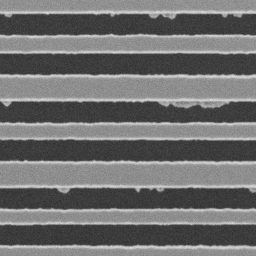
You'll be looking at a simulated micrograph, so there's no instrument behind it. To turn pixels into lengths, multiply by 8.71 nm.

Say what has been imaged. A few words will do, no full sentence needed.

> lines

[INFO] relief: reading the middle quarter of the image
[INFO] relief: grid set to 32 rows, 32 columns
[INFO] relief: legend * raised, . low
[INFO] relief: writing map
................................
................................
................................
********************************
********************************
********************************
********************************
********************************
********************************
................................
................................
................................
................................
................................
................................
********************************
********************************
********************************
********************************
................................
................................
................................
................................
................................
.**.******.*********.**..**.*.**
********************************
********************************
********************************
********************************
********************************
********************************
................................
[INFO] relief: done